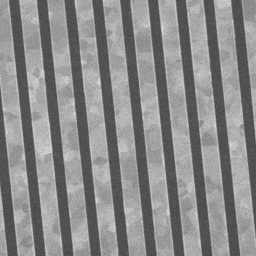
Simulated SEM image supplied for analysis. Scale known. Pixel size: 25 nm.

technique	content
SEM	parallel lines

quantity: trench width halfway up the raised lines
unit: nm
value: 276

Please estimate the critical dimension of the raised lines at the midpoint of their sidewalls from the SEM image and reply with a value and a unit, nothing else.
416 nanometres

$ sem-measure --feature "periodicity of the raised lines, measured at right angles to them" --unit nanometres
690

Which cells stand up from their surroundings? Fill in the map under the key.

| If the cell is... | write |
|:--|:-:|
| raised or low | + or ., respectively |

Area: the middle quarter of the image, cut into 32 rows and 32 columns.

+....+++....+++....+++...++++...
++...++++...++++...++++...+++...
++...++++......+...++++...++++..
++...++++......+...++++...++++..
++...++++...++++...++++...++++..
++...++++...++++...++++...++++..
++...++++...++++...++++...++++..
++...++++...++++...++++...++++..
++...++++...++++...++++...++++..
++....+++...++++...++++...++++..
+.....++++...++++...+++....+++..
+.....++++...++++...++++...++++.
+++...++++...++++...+++....++++.
+++...++++...++++...++++...++++.
+++...++++...++++...++++...++++.
+++...++++...++++...++++...++++.
+++...++++...++++...++++...++++.
+++...++++...++++...++++...++++.
+++...++++...++++...++++...++++.
+++....+++....+++...++++...++++.
++++...++++...++++...+++....+++.
++++...++++...++++...++++...++++
++++...++++...++++...++++...++++
++++...++++...++++...++++...++++
++++...++++...++++...++++...++++
++++...++++...++++...++++...++++
++++...++++...++++...++.+...++++
.+++...++++...++++...++++...++++
.+++...++++...++++...++++...++++
.++++...+++....+++....+++...++++
.++++...++++...++++...++++...+++
.++++...++++...++++...++++...+++